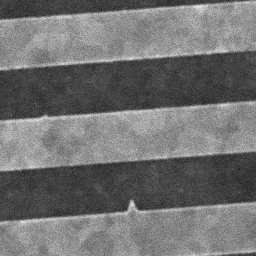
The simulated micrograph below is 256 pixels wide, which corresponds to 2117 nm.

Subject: one or a few lines or trenches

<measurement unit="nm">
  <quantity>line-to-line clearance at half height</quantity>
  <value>427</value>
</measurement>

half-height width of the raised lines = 403 nanometres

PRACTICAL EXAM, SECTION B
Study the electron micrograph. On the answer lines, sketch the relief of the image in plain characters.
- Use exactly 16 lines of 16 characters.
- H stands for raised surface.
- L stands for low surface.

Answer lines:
LLLLLLLLLLHHHHHH
HHHHHHHHHHHHHHHH
HHHHHHHHHHHHHHHH
HHHHHHHHHHHLLLLL
LLLLLLLLLLLLLLLL
LLLLLLLLLLLLLLLL
LLLLLLLLLLLLLLHH
LHHHHHHHHHHHHHHH
HHHHHHHHHHHHHHHH
HHHHHHHHHHHHHHHL
HHLLLLLLLLLLLLLL
LLLLLLLLLLLLLLLL
LLLLLLLLLLLLLLLL
LLLLLHHHHHHHHHHH
HHHHHHHHHHHHHHHH
HHHHHHHHHHHHHHHH